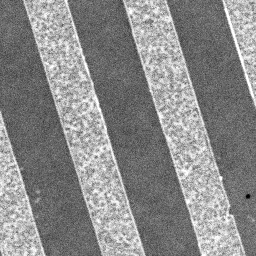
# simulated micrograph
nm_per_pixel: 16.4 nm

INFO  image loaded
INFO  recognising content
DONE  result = one or a few lines or trenches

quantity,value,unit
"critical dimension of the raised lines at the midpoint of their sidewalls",595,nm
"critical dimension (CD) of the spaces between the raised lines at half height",55.3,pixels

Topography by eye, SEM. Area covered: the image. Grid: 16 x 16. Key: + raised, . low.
..++....++....++
..+++...+++...++
..+++...+++....+
...++....++....+
...++....+++...+
...+++...+++....
....++....++....
....++....+++...
....+++...+++...
+...+++....++...
+....++....+++..
+....+++...+++..
++...+++....++..
++....++....++..
++....+++...+++.
+++...+++....++.